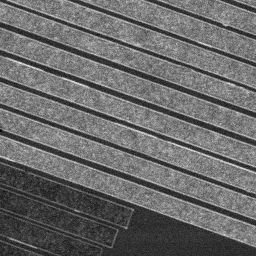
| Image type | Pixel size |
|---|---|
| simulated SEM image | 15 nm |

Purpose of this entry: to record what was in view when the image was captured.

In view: parallel lines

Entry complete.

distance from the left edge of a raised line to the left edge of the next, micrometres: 0.374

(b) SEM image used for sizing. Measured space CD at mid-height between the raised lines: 88.4 nanometres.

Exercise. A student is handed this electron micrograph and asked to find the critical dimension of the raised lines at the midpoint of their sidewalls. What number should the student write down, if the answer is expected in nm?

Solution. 286